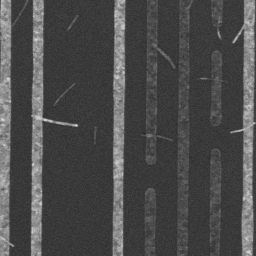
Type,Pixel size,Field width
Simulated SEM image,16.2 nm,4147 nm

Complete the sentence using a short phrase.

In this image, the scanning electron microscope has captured groups of lines, slits or small figures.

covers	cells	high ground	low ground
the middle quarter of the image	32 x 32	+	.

.............++......++....+.++.
.............++......++......++.
.............++......++......++.
.............++......++......++.
.............++......++......++.
.............++......++......++.
.............++......++......++.
.............++......++......++.
.............++......++......++.
.............++......++......++.
.............++......++......++.
.............++......++......++.
.............++......++......++.
.............++......++......++.
.............++......++......++.
..+..........++......++......++.
.............++......++......++.
.............++......++......++.
.............++......++......++.
.............++......++......++.
.............++......++......++.
.............++......++......++.
.............++......++......++.
.............++......++......++.
............+++......++......++.
............+++..............++.
............+++..............++.
.............++..............++.
.............++..............++.
.............++..............++.
.............++..............++.
.............++......+.......++.